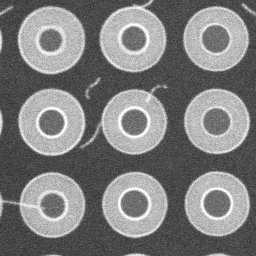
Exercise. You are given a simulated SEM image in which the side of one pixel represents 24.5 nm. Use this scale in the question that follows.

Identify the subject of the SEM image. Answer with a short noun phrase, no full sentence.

an array of small figures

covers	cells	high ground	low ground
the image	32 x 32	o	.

oooooooooooooooooooooooooooooooo
oooo....ooooooo....oooooo....ooo
ooo.......ooo.......oooo......oo
ooo...o...ooo...oo..ooo...oo...o
oo...ooo..ooo..ooo...oo..oooo..o
oo...ooo..ooo..ooo...oo..oooo..o
ooo..oo...ooo...o...ooo...oo...o
ooo.......oooo......oooo......oo
oooo....ooooooo...oooooooo...ooo
oooooooooooooooooooooooooooooooo
oooooooooooooooooooooooooooooooo
ooooo...oooooooo..oooooooo..oooo
oooo.....ooooo......oooo......oo
ooo.......ooo...o...oooo..oo...o
ooo..ooo..ooo..ooo...oo..oooo..o
oo...ooo..ooo..oooo..oo..oooo..o
ooo..ooo..ooo..ooo..ooo...oo...o
ooo.......oooo......oooo......oo
oooo.....oooooo....oooooo....ooo
oooooooooooooooooooooooooooooooo
oooooooooooooooooooooooooooooooo
oooooooooooooooooooooooooooooooo
oooo.....ooooo.....oooooo.....oo
ooo.......oooo......oooo.......o
ooo..ooo..ooo..ooo...oo...ooo..o
ooo..ooo...oo..oooo..oo..oooo..o
ooo..ooo..ooo..ooo...oo...ooo..o
ooo.......ooo.......oooo.......o
oooo.....ooooo......ooooo.....oo
oooooo.ooooooooooooooooooooooooo
oooooooooooooooooooooooooooooooo
oooooooooooooooooooooooooooooooo